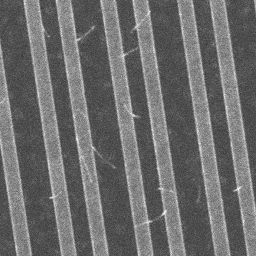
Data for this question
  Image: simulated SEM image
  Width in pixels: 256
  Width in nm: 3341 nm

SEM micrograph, parallel lines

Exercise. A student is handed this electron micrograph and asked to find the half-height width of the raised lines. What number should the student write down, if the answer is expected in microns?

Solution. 0.186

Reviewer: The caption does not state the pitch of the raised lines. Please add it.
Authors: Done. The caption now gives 492 nm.